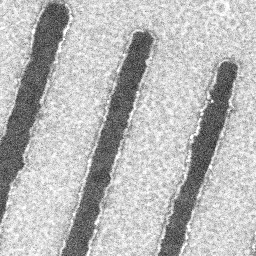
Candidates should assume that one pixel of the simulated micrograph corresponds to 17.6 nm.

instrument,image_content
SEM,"one or a few lines or trenches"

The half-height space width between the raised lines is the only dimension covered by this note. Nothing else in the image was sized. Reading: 1160 nanometres